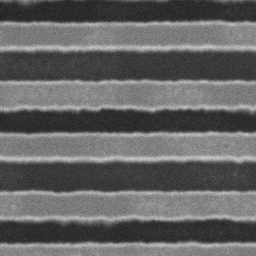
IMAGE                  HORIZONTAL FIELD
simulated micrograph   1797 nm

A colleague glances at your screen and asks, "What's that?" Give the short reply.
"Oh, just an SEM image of lines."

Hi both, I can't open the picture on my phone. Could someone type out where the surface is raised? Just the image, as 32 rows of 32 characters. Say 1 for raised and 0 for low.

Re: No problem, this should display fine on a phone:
00000000000000000000000000000000
00000000000000000000000000000000
00000000000000000000000000000000
11111111111111111111111111111111
11111111111111111111111111111111
11111111111111111111111111111111
00000000000000000000000000000000
00000000000000000000000000000000
00000000000000000000000000000000
00000000000000000000000000000000
11111111111111111111111111111111
11111111111111111111111111111111
11111111111111111111111111111111
11111111110111111111111110111101
00000000000000000000000000000000
00000000000000000000000000000000
00000000000000000000000000000000
11111111111111111111111111111111
11111111111111111111111111111111
11111111111111111111111111111111
00000000000000000000000000000000
00000000000000000000000000000000
00000000000000000000000000000000
00000000000000000000000000000000
11111111111111111111111111111111
11111111111111111111111111111111
11111111111111111111111111111111
00000000000000000000000000000000
00000000000000000000000000000000
00000000000000000000000000000000
10001000001111011111101110111111
11111111111111111111111111111111